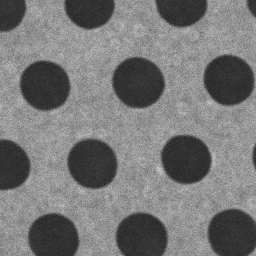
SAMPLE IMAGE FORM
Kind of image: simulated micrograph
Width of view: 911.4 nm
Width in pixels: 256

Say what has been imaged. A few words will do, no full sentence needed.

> holes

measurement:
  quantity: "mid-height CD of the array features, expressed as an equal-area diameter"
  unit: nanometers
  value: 180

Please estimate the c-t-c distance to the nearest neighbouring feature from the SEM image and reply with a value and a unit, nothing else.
0.321 microns